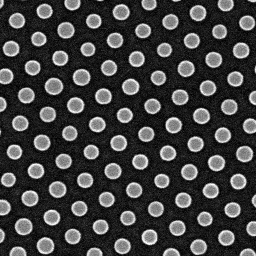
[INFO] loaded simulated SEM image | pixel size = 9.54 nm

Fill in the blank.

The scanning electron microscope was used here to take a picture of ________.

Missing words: a regular array of raised bodies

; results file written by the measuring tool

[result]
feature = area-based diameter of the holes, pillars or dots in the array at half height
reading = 144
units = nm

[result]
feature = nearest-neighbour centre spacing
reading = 271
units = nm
